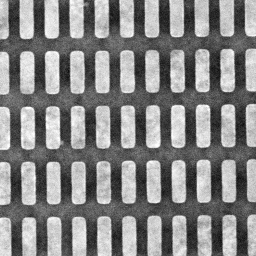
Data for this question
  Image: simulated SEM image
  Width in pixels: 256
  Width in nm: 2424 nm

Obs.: groups of lines, slits or small figures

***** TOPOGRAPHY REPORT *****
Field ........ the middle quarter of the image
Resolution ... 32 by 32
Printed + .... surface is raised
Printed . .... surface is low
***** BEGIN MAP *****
..+++...+++...++++...+++...+++..
..+++...+++...++++...+++...+++..
..+++...+++...++++...+++...+++..
..+++...+++...++++...+++...+++..
..+++...+++...++++...+++...+++..
..+++...+++...++++...+++...+++..
..+++...+++...++++...+++...+++..
................................
................................
................................
......................+....+++..
..+++...+++...++++...+++...+++..
..+++...+++...++++...+++...+++..
..+++...+++...++++...+++...+++..
..+++...+++...++++...+++...+++..
..+++...+++...++++...+++...+++..
..+++...+++...++++...+++...+++..
..+++...+++...++++...+++...+++..
..+++...+++...++++...+++...+++..
..+++...+++...++++...+++...+++..
..+++...+++....+++...+++...+++..
................................
................................
................................
.........++....++....+++...+++..
..+++...+++....+++...+++...+++..
..+++...+++....+++...+++...+++..
..+++...+++....+++...+++...+++..
..+++...+++....+++...+++...+++..
..+++...+++....+++...+++...+++..
..+++...++++...+++...+++...+++..
..+++...++++...+++...+++...+++..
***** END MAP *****